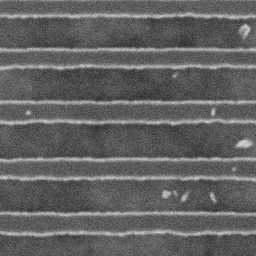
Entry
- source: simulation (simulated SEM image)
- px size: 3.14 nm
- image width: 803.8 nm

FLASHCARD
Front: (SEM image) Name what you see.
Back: lines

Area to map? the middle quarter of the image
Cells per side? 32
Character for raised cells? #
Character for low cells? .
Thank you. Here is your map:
################################
................................
................................
................................
................................
................................
................................
................................
................................
..#.####....####.########.....##
################################
################################
################################
################################
.###############################
................................
................................
................................
................................
................................
................................
................................
................................
................................
################################
################################
################################
################################
################################
................................
................................
................................